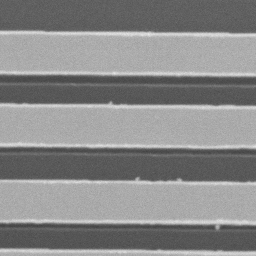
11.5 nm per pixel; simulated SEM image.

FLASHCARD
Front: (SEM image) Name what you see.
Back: lines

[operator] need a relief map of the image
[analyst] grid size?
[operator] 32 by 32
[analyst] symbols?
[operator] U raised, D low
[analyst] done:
DDDDDDDDDDDDDDDDDDDDDDDDDDDDDDDD
DDDDDDDDDDDDDDDDDDDDDDDDDDDDDDDD
DDDDDDDDDDDDDDDDDDDDDDDDDDDDDDDD
DDDDDDDDDDDDDDDDDDDDDDDDDDDDDDDD
UUUUUUUUUUUUUUUUUUUUUUUUUUUUUUUU
UUUUUUUUUUUUUUUUUUUUUUUUUUUUUUUU
UUUUUUUUUUUUUUUUUUUUUUUUUUUUUUUU
UUUUUUUUUUUUUUUUUUUUUUUUUUUUUUUU
UUUUUUUUUUUUUUUUUUUUUUUUUUUUUUUU
DDDDDDDDDDDDDDDDDDDDDDDDDDDDDDDD
DDDDDDDDDDDDDDDDDDDDDDDDDDDDDDDD
DDDDDDDDDDDDDDDDDDDDDDDDDDDDDDDD
DDDDDDDDDDDDDDDDDDDDDDDDDDDDDDDD
UUUUUUUUUUUUUUUUUUUUUUUUUUUUUUUU
UUUUUUUUUUUUUUUUUUUUUUUUUUUUUUUU
UUUUUUUUUUUUUUUUUUUUUUUUUUUUUUUU
UUUUUUUUUUUUUUUUUUUUUUUUUUUUUUUU
UUUUUUUUUUUUUUUUUUUUUUUUUUUUUUUU
DDDDDDDDDDDDDDDDDDDDDDDDUUUUUDDU
DDDDDDDDDDDDDDDDDDDDDDDDDDDDDDDD
DDDDDDDDDDDDDDDDDDDDDDDDDDDDDDDD
DDDDDDDDDDDDDDDDDDDDDDDDDDDDDDDD
DDDDDDDDDDDDDDDDDDDDDDDDDDDDDDDD
UUUUUUUUUUUUUUUUUUUUUUUUUUUUUUUU
UUUUUUUUUUUUUUUUUUUUUUUUUUUUUUUU
UUUUUUUUUUUUUUUUUUUUUUUUUUUUUUUU
UUUUUUUUUUUUUUUUUUUUUUUUUUUUUUUU
UUUUUUUUUUUUUUUUUUUUUUUUUUUUUUUU
DDDDDDDDDDDDDDDDDDDDDDDDDDDDDDDD
DDDDDDDDDDDDDDDDDDDDDDDDDDDDDDDD
DDDDDDDDDDDDDDDDDDDDDDDDDDDDDDDD
UUUUUUUUUUUUUUUUUUUUUUUUUUUUUUUU